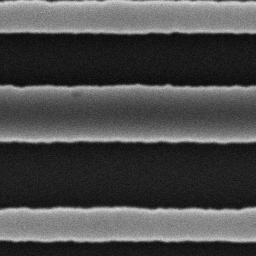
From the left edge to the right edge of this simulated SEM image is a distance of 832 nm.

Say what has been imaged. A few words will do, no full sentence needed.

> lines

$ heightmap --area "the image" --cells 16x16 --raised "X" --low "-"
XXXXXXXXXXXXXXXX
XXXXXXXXXXXXXXXX
----------------
----------------
----------------
XXXXXXXXXXXXXXXX
XXXXXXXXXXXXXXXX
XXXXXXXXXXXXXXXX
XXXXXXXXXXXXXXXX
----------------
----------------
----------------
----------------
XXXXXXXXXXXXXXXX
XXXXXXXXXXXXXXXX
----------------